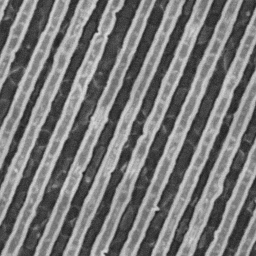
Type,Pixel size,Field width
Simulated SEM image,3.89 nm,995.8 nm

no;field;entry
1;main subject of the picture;parallel lines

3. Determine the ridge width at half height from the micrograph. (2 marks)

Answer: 0.042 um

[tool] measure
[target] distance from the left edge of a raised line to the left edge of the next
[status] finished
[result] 104 nm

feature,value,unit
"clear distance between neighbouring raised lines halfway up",62.7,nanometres